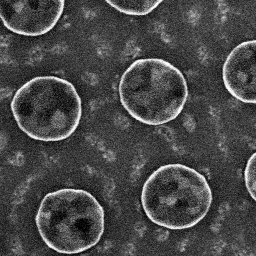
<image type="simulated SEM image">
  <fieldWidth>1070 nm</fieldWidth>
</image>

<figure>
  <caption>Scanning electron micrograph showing raised bodies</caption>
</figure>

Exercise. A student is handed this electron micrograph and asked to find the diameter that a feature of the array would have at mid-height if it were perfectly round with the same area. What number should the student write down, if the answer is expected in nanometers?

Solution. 277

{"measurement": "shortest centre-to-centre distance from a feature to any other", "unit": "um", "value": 0.45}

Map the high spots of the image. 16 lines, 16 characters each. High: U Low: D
UUUUDDDUUUDDDDDD
UUUDDDDDDDDDDDDD
DDDDDDDDDDDDDDDD
DDDDDDDDDDDDDDUU
DDDDDDDDUUUDDDUU
DUUUUDDUUUUUDDUU
DUUUUDDDUUUDDDDD
DUUUUDDDDUUDDDDD
DDUUDDDDDDDDDDDD
DDDDDDDDDDDDDDDD
DDDDDDDDDDUUDDDU
DDDDDDDDDUUUUDDU
DDDUUUDDDUUUUDDD
DDUUUUDDDUUUUDDD
DDUUUUDDDDDDDDDD
DDDUUDDDDDDDDDDD